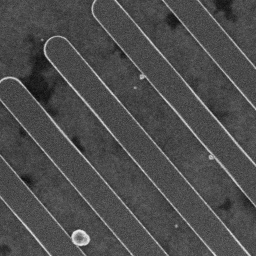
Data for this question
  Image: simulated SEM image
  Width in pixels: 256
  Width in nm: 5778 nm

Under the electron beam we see groups of lines, slits or small figures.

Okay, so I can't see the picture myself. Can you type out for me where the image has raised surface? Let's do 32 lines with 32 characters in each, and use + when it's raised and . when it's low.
............+++......++++.......
............++++......++++......
............+++++.....+++++.....
.............++++......+++++....
..............++++......+++++...
......+++......++++......++++...
......++++......++++......++++..
......+++++.....+++++......++++.
.......++++......+++++......++++
........++++......+++++.....++++
+++......++++......++++......+++
++++......++++......++++......++
++++......+++++......++++......+
.++++......+++++......++++......
..++++......++++......+++++.....
...++++......++++......+++++....
...+++++......++++......++++....
....+++++......++++......++++...
.....++++......+++++......++++..
......++++......+++++.....+++++.
+......++++......+++++......++++
++......++++......++++......++++
+++......++++......++++......+++
++++.....+++++......++++......++
++++......+++++......++++......+
.++++......+++++.....+++++......
..++++......++++......+++++.....
...++++......++++......+++++....
...+++++......++++......++++....
....+++++++...+++++......++++...
.....++++++....+++++......++++..
......++++......+++++......++++.